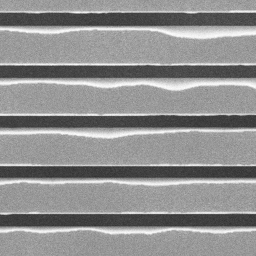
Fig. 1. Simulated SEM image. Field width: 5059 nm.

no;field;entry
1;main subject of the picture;lines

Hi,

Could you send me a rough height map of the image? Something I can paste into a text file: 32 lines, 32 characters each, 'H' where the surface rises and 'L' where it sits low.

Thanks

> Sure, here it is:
HHHHHHHHHHHHHHHHHHHHHHHHHHHHHHHH
LLLLHHLLHHHHHHLLLLLLLLLHHLLLLLLL
LLLLLLLLLLLLLLLLLLLLLLLLLLLLLLLL
LLLLLLLLLLLHHLLHHLLLLLLLLLLLLLLL
HHHHHHHHHHHHHHHHHHHHHHHHHHHHHHHH
HHHHHHHHHHHHHHHHHHHHHHHHHHHHHHHH
HHHHHHHHHHHHHHHHHHHHHHHHHHHHHHHH
HHHHHHHHHHHHHHHHHHHHHHHHHHHHHHHH
LLLLLLLLLLLLLLLLLLLLLLLLLLLLLLLL
LLLLLLLLLLLLLLLLLLLLLLLLLLLLLLLL
HHHHHHHHHHHHHHHHHHHHHHHHHHHHHHHH
HHHHHHHHHHHHHHHHHHHHHHHHHHHHHHHH
HHHHHHHHHHHHHHHHHHHHHHHHHHHHHHHH
HHHHHHHHHHHHHHHHHHHHHHHHHHHHHHHH
LLLLLLLLLLLLLLLLLLLLLLLLLLLLLLLL
LLLLLLLLLLLLLLLLLLLLLLLLLLLLLLLL
HHHHHHHHHHHHLLHHHHHHHHHHHHHHHHHH
HHHHHHHHHHHHHHHHHHHHHHHHHHHHHHHH
HHHHHHHHHHHHHHHHHHHHHHHHHHHHHHHH
HHHHHHHHHHHHHHHHHHHHHHHHHHHHHHHH
HHHHHHHHHHHHHHHHHHHHHHHHHHHHHHHH
LLLLLLLLLLLLLLLLLLLLLLLLLLLLLLLL
LLLLLLLLLLLLLLLLLLLLLLLLLLLLLLLL
HHHHHHHHHHHHHHHHHHHHHHHHHHHHHHHH
HHHHHHHHHHHHHHHHHHHHHHHHHHHHHHHH
HHHHHHHHHHHHHHHHHHHHHHHHHHHHHHHH
HHHHHHHHHHHHHHHHHHHHHHHHHHHHHHHH
LLLLLLLLLLLLLLLLLLLLLLLLLLLLLLLL
LLHLLLLLLHHHLLLLLLLLHHHHLLLLLLLL
HHHHHHHHHHHHHHHHHHHHHHHHHHHHHHHH
HHHHHHHHHHHHHHHHHHHHHHHHHHHHHHHH
HHHHHHHHHHHHHHHHHHHHHHHHHHHHHHHH